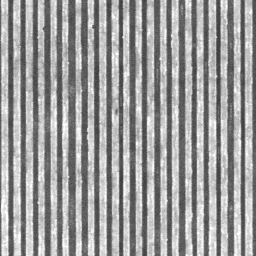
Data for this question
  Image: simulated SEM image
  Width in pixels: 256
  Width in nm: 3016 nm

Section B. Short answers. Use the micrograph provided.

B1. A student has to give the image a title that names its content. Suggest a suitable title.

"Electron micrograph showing parallel lines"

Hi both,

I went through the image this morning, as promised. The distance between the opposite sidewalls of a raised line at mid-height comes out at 67.7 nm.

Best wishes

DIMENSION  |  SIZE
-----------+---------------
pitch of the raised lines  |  144 nm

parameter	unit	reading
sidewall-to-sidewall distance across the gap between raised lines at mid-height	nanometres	67.7